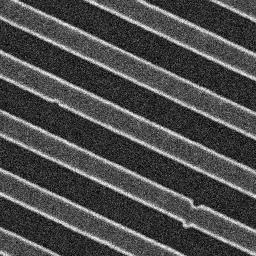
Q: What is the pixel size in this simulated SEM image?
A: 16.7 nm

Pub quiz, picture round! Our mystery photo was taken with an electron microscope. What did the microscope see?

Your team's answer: parallel lines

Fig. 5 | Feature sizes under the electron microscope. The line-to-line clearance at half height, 0.511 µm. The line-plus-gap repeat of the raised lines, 885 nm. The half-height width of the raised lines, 384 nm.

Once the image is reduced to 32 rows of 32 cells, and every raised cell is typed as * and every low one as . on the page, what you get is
***.........******.........*****
*****.........*******.........**
*******.........*******.........
...******.........*******.......
.....******.........*******.....
.......******.........*******...
.........*******.........******.
**.........*******.........*****
****.........*******.........***
*******........*******.........*
..*******........*******........
....*******.........******......
......*******.........******....
........*******.........******..
**........*******.........******
****.........******.........****
******.........******.........**
.*******.........******.........
...*******.........*******......
.....*******.........*******....
........******.........*******..
*.........******.........*******
***.........******..........****
*****.........*******........***
.******.........*******.........
...******.........******........
.....******..........******.....
.......******.........*******...
.........*******.........******.
**.........*******.........*****
****.........*******.........***
******.........*******.........*